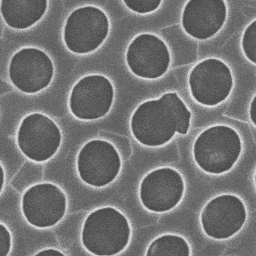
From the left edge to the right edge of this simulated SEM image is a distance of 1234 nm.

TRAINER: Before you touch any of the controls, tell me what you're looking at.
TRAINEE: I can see a regular array of holes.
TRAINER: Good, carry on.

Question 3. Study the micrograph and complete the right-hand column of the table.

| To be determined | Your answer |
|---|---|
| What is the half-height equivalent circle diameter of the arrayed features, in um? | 0.218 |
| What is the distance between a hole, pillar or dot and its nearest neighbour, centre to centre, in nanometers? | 317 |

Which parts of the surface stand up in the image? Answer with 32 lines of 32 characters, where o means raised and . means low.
......oooooooooo....ooo.....oooo
......ooo....oooo..oooo.....oooo
o....ooo......ooooooooo.....oooo
oo.ooooo......ooooooooo.....ooo.
oooooooo.....oooo...oooo...ooo..
oooooooo.....ooo.....ooooooooo..
oo...oooo..ooooo.....ooooooooo..
o.....oooooooooo.....ooooo.oooo.
o......ooooooooo.....ooo.....ooo
o......oooo..oooo...oooo.....ooo
oo....oooo....oooooooooo.....ooo
ooo..oooo.....oooooooooo.....ooo
ooooooooo.....ooooo....o....oooo
ooooooooo.....ooo......oooooooo.
ooo...ooo....oooo.......ooooooo.
ooo....ooooooooo........oooooooo
oo......ooooooooo......oo....ooo
oo......oooo.oooo....ooo......oo
oo.....ooo....oooooooooo......oo
ooo...oooo.....ooooooooo......oo
oooooooooo.....oooooooooo....ooo
oooooooooo.....oooo...oooo..oooo
.ooooooooo....oooo.....ooooooooo
oooo...ooooooooooo.....ooooooooo
ooo.....oooooooooo.....oooo..ooo
ooo.....oooooooooo....oooo....oo
ooo.....oooo...oooo.ooooo......o
ooo....oooo.....ooooooooo......o
.ooooooooo......ooooooooo.....oo
.ooooooooo......oooo..oooo...ooo
.ooooooooo......ooo....ooooooooo
.oooo...ooo....ooo......oooooooo